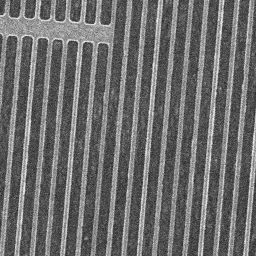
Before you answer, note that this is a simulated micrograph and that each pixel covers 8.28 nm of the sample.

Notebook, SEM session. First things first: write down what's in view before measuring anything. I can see parallel lines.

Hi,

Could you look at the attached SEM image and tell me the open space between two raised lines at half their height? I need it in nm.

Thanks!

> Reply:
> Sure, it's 95.9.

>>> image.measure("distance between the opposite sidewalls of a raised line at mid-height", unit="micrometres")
0.032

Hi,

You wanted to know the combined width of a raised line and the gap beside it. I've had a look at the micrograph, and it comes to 126 nanometres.